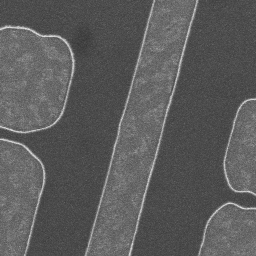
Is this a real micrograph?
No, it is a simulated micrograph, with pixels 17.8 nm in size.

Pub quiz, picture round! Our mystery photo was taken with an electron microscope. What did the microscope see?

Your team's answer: one or a few lines or trenches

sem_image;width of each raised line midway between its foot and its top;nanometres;1210